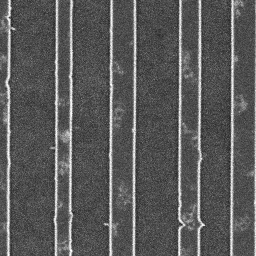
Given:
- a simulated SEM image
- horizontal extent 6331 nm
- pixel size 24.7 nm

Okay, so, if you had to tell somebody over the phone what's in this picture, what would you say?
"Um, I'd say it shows one or a few lines or trenches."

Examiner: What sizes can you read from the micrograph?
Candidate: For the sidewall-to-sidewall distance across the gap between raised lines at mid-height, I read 1050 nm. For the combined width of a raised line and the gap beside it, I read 1560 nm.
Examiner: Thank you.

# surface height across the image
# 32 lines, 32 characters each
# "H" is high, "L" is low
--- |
HLLLLLLHHLLLLLHHHLLLLLLHHLLLLHHH
HLLLLLLHHLLLLLHHHLLLLLLHHLLLLHHH
HLLLLLLHHLLLLLHHHLLLLLLHHLLLLHHH
HLLLLLLHHLLLLLHHHLLLLLLHHLLLLHHH
HLLLLLLHHLLLLLHHHLLLLLLHHLLLLHHH
HLLLLLLHHLLLLLHHHLLLLLLHHLLLLHHH
HLLLLLLHHLLLLLHHHLLLLLLHHLLLLHHH
HLLLLLLHHLLLLLHHHLLLLLLHHLLLLHHH
HLLLLLLHHLLLLLHHHLLLLLLHHLLLLHHH
HLLLLLLHHLLLLLHHHLLLLLLHHLLLLHHH
HLLLLLLHHLLLLLHHHLLLLLLHHLLLLHHH
HLLLLLLHHLLLLLHHHLLLLLLHHLLLLHHH
HLLLLLLHHLLLLLHHHLLLLLLHHLLLLHHH
HLLLLLLHHLLLLLHHHLLLLLLHHLLLLHHH
HLLLLLLHHLLLLLHHHLLLLLLHHLLLLHHH
HLLLLLLHHLLLLLHHHLLLLLLHHLLLLHHH
HLLLLLLHHLLLLLHHHLLLLLLHHLLLLHHH
HLLLLLLHHLLLLLHHHLLLLLLHHLLLLHHH
HLLLLLLHHLLLLLHHHLLLLLLHHLLLLHHH
HLLLLLLHHLLLLLHHHLLLLLLHHLLLLHHH
HLLLLLLHHLLLLLHHHLLLLLHHHLLLLHHH
HLLLLLLHHLLLLLHHHLLLLLHHHLLLLHHH
HLLLLLLHHLLLLLHHHLLLLLHHHLLLLHHH
HLLLLLLHHLLLLLHHHLLLLLHHHLLLLHHH
HLLLLLLHHLLLLLHHHLLLLLHHHLLLLHHH
HLLLLLLHHLLLLLHHHLLLLLHHHLLLLHHH
HLLLLLLHHLLLLLHHHLLLLLHHHLLLLHHH
HLLLLLLHHLLLLLHHHLLLLLLHHLLLLHHH
HLLLLLLHHLLLLLHHHLLLLLLHHLLLLHHH
HLLLLLLHHLLLLLHHHLLLLLHHHLLLLHHH
HLLLLLLHHLLLLLHHHLLLLLHHHLLLLHHH
HLLLLLLHHLLLLLHHHLLLLLHHHLLLLHHH